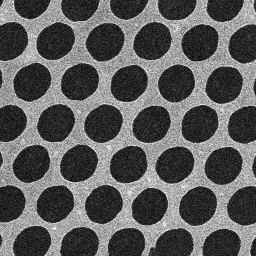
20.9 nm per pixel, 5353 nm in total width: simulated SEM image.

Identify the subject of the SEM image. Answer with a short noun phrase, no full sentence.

a regular array of holes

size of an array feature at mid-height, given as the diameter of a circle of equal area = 790 nm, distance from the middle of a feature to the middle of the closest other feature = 974 nm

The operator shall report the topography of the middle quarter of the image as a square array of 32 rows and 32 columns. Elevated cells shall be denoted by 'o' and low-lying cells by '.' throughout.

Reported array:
oo.....ooooooooo...oooooooo...oo
o.......oooooo......ooooo.......
.........oooo........ooo........
.........ooo.........ooo........
.........ooo.........ooo........
.........ooo.........oo.........
........oooo........oooo........
.......ooooo........oooo........
o.....ooooooo......oooooo......o
oooooooooooooo...oooooooooo..ooo
.oooooooo....ooooooooo..oooooooo
..ooooo.......oooooo......ooooo.
...ooo........ooooo.......oooo..
...ooo.........ooo........oooo..
...oo..........oo..........oo...
..ooo.........ooo..........oo...
..ooo.........ooo.........ooo...
..oooo.......oooo.........ooo...
.ooooo.......ooooo.......ooooo..
oooooooo...oooooooo....ooooooooo
ooo...oooooooooo..oooooooooooooo
o......ooooooo......ooooo......o
........ooooo........ooo........
........oooo.........ooo........
........ooo..........oo.........
........ooo..........oo.........
........ooo..........oo.........
.......ooooo........ooo........o
.......ooooo.......ooooo.......o
oo..ooooooooo.....ooooooo....ooo
ooooooooo...oooooooooooooooooooo
.oooooo......ooooooo....ooooooo.